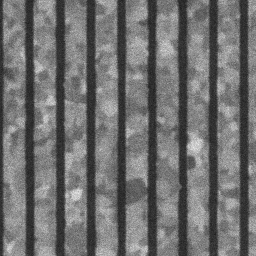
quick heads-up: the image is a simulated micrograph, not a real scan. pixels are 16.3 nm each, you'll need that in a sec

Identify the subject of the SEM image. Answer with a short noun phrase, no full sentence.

parallel lines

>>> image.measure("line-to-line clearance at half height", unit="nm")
161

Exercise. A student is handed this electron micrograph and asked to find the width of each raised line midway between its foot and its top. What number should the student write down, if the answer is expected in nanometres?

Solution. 337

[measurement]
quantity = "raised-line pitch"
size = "500 nm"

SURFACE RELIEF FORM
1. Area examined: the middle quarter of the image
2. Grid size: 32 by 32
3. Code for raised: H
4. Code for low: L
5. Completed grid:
LHHHHLLLHHHHHLLLHHHHHLLHHHHHHLLH
LHHHHLLLHHHHHLLLHHHHHLLHHHHHHLLH
HHHHHLLLHHHHHLLLHHHHHLLHHHHHLLLH
HHHHHLLLHHHHHLLLHHHHHLLHHHHHLLLH
HHHHHLLLHHHHHLLLHHHHHLLHHHHHLLLH
HHHHHLLLHHHHHLLLHHHHHLLHHHHHLLLH
HHHHHLLLHHHHHLLLHHHHHLLHHHHHLLLH
HHHHHLLLHHHHHLLLHHHHHLLHHHHHLLLH
HHHHHLLLHHHHHLLLHHHHHLLHHHHHLLLH
HHHHHLLLHHHHHLLLHHHHHLLHHHHHLLLH
HHHHHLLLHHHHHLLLHHHHHLLHHHHHLLLH
HHHHHLLLHHHHHLLLHHHHHLLHHHHHLLLH
HHHHHLLLHHHHHLLLHHHHHLLHHHHHLLLH
HHHHHLLLHHHHHLLLHHHHHLLHHHHHHLLH
HHHHHLLLHHHHHLLLHHHHHLLHHHHHHLLH
HHHHHHLLHHHHHLLLHHHHHLLHHHHHHLLH
HHHHHLLLHHHHHLLLHHHHHLLHHHHHLLLH
HHHHHLLLHHHHHLLLHHHHHLLHHHHHLLLH
HHHHHLLLHHHHHLLLHHHHHLLHHHHHHLLH
HHHHHLLLHHHHHLLLHHHHHLLHHHHHLLLH
LHHHHLLLHHHHHLLLHHHHHLLHHHHHLLLH
HHHHHLLLHHHHHLLLHHHHHLLHHHHHLLLH
HHHHHLLLHHHHHLLLHHHHHLLHHHHHLLLH
LHHHHHLLHHHHHLLLHHHHHLLHHHHHLLLH
HHHHHHLLHHHHHLLLHHHHHLLHHHHHLLLH
LHHHHHLLHHHHHLLLHHHHHLLHHHHHLLLH
LHHHHHLLHHHHHLLLHHHHHLLHHHHHLLLH
HHHHHHLLHHHHHLLLHHHHHLLHHHHHLLLH
HHHHHLLLHHHHHLLLHHHHHLLHHHHHLLLH
HHHHHHLLHHHHHLLLHHHHHLLHHHHHHLLH
LHHHHLLLHHHHHLLLHHHHHLLHHHHHHLLH
LHHHHHLLHHHHHLLLHHHHHLLHHHHHHLLH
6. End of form